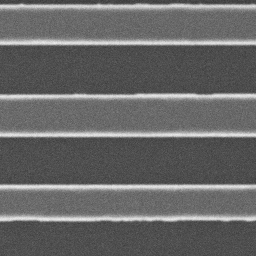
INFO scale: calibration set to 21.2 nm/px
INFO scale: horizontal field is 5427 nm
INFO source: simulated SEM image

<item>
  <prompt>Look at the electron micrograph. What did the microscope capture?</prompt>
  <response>lines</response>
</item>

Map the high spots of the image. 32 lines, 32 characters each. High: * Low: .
................................
********************************
********************************
********************************
********************************
********************************
................................
................................
................................
................................
................................
................................
********************************
********************************
********************************
********************************
********************************
................................
................................
................................
................................
................................
................................
********************************
********************************
********************************
********************************
**...*******..*.....**.........*
................................
................................
................................
................................